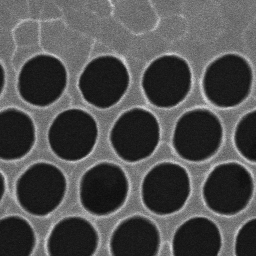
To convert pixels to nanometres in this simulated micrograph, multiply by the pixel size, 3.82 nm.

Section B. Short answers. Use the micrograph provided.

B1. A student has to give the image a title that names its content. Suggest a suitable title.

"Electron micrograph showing a regular array of holes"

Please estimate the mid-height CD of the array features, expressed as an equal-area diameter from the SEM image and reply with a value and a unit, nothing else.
191 nm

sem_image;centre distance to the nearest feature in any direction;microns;0.236